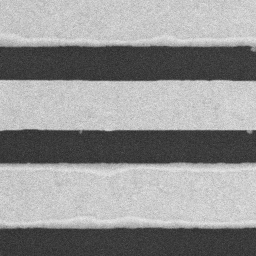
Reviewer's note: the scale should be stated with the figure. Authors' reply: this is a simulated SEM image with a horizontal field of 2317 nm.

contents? lines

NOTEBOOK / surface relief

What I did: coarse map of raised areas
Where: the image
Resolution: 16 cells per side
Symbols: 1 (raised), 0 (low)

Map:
1111111111111111
1111111111111111
1111111111111111
0000000000000000
0000000000000000
1111111111111111
1111111111111111
1111111111111111
0000000000000000
0000000000000000
1111111111111111
1111111111111111
1111111111111111
1111111111111111
0000000000000000
0000000000000000